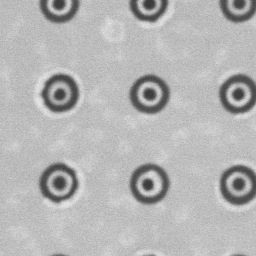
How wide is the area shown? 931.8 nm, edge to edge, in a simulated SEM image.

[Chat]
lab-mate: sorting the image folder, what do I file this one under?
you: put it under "ring-shaped grooves with a dot in the middle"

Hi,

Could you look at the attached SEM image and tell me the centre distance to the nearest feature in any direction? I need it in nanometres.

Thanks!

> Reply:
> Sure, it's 324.